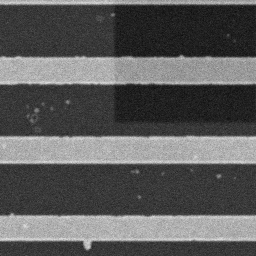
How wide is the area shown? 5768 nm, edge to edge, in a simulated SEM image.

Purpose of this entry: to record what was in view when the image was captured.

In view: lines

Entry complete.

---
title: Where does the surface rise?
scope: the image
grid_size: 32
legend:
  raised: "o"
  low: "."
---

................................
................................
................................
................................
................................
................................
................................
oooooooooooooooooooooooooooooooo
oooooooooooooooooooooooooooooooo
oooooooooooooooooooooooooooooooo
................................
................................
................................
................................
................................
................................
................................
oooooooooooooooooooooooooooooooo
oooooooooooooooooooooooooooooooo
oooooooooooooooooooooooooooooooo
................................
................................
................................
................................
................................
................................
................................
oooooooooooooooooooooooooooooooo
oooooooooooooooooooooooooooooooo
oooooooooooooooooooooooooooooooo
................................
................................